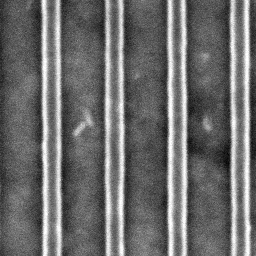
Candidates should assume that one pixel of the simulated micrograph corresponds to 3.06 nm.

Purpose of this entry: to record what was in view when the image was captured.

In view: parallel lines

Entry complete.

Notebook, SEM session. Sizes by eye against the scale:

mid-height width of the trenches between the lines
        144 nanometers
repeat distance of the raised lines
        0.192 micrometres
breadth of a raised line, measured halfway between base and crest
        47.8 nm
